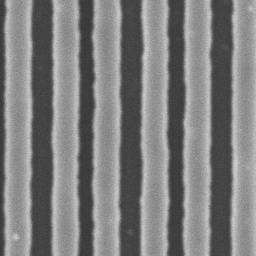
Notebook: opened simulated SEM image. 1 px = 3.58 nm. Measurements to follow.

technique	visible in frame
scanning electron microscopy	lines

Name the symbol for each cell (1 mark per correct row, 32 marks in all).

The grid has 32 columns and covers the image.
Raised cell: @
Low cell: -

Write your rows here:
-@@@---@@@--@@@---@@@--@@@---@@@
-@@@---@@@--@@@---@@@--@@@---@@@
-@@@---@@@--@@@---@@@--@@@---@@@
-@@@---@@@--@@@---@@@--@@@---@@@
-@@@---@@@--@@@---@@@--@@@---@@@
-@@@---@@@--@@@---@@@--@@@---@@@
-@@@---@@@--@@@---@@@--@@@---@@@
-@@@---@@@--@@@---@@@--@@@---@@@
-@@@---@@@--@@@---@@@--@@@---@@@
-@@@---@@@--@@@---@@@--@@@---@@@
-@@@---@@@--@@@---@@@--@@@---@@@
-@@@---@@@--@@@---@@@--@@@---@@@
-@@@---@@@--@@@---@@@--@@@---@@@
-@@@---@@@--@@@---@@@--@@@---@@@
-@@@---@@@--@@@---@@@--@@@---@@@
-@@@---@@@--@@@---@@@--@@@---@@@
-@@@---@@@--@@@---@@@--@@@---@@@
-@@@---@@@--@@@---@@@--@@@---@@@
-@@@---@@@--@@@---@@@--@@@---@@@
-@@@---@@@--@@@---@@@--@@@---@@@
-@@@---@@@--@@@---@@@--@@@---@@@
-@@@---@@@--@@@---@@@--@@@---@@@
-@@@---@@@--@@@---@@@--@@@---@@@
-@@@---@@@--@@@---@@@--@@@---@@@
-@@@---@@@--@@@---@@@--@@@---@@@
-@@@---@@@--@@@---@@@--@@@---@@@
-@@@---@@@--@@@---@@@--@@@---@@@
-@@@---@@@--@@@---@@@--@@@---@@@
-@@@---@@@--@@@---@@@--@@@---@@@
-@@@---@@@--@@@---@@@--@@@---@@@
-@@@---@@@--@@@---@@@--@@@---@@@
-@@@---@@@--@@@---@@@--@@@---@@@